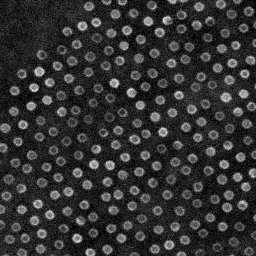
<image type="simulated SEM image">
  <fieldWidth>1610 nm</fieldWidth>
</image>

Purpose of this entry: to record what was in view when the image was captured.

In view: a regular array of raised bodies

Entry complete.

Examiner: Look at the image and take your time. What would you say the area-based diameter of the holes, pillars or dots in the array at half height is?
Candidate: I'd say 8.2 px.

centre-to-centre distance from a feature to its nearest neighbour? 96.4 nm